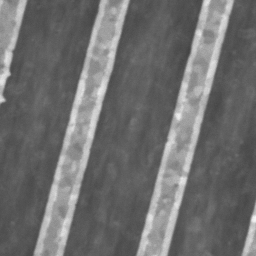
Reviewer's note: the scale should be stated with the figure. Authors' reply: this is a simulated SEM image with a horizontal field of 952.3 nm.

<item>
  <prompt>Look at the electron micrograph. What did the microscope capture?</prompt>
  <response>one or a few lines or trenches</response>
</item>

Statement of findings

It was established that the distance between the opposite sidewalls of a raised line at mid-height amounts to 87.6 nm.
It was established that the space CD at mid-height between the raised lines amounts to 76.6 px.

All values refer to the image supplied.